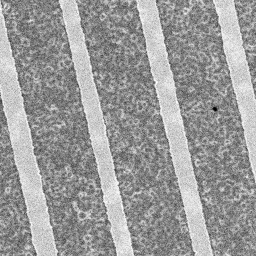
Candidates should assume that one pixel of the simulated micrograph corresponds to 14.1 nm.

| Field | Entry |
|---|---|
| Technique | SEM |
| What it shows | one or a few lines or trenches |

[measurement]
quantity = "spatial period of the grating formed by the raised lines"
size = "1070 nm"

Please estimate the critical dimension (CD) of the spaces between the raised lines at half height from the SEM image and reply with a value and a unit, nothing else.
828 nm